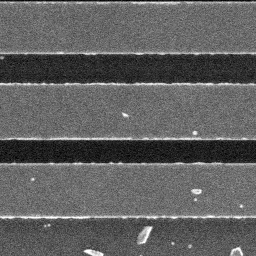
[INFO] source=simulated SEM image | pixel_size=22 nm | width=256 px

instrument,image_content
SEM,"lines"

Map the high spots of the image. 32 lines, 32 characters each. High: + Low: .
++++++++++++++++++++++++++++++++
++++++++++++++++++++++++++++++++
++++++++++++++++++++++++++++++++
++++++++++++++++++++++++++++++++
++++++++++++++++++++++++++++++++
++++++++++++++++++++++++++++++++
++++++++++++++++++++++++++++++++
................................
................................
................................
++++++..++.+++++.+++++++++++++.+
++++++++++++++++++++++++++++++++
++++++++++++++++++++++++++++++++
++++++++++++++++++++++++++++++++
++++++++++++++++++++++++++++++++
++++++++++++++++++++++++++++++++
++++++++++++++++++++++++++++++++
................................
................................
................................
......+..+++.+.+......+.++++....
++++++++++++++++++++++++++++++++
++++++++++++++++++++++++++++++++
++++++++++++++++++++++++++++++++
++++++++++++++++++++++++++++++++
++++++++++++++++++++++++++++++++
++++++++++++++++++++++++++++++++
................................
................................
................................
................................
................................